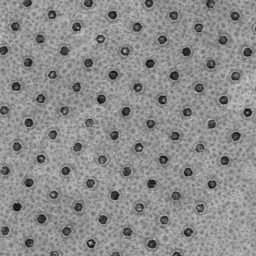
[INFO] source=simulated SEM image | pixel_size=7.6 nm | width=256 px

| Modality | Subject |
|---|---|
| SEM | a regular array of holes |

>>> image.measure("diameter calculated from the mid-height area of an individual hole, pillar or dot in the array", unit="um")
0.0722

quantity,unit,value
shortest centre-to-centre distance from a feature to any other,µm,0.202